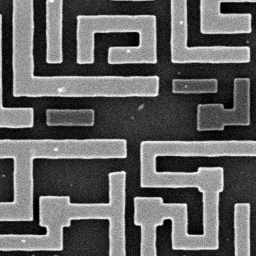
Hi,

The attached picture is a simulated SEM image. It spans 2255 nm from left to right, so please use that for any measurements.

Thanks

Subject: wiring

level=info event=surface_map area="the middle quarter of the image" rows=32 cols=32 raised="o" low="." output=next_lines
................................
................................
................................
oooooooooooooooooooooooo........
oooooooooooooooooooooooo...ooooo
oooooooooooooooooooooooo...ooooo
oooooooooooooooooooooooo...ooooo
ooooooooooooooooooooooo.........
................................
................................
................................
oo..ooo.........................
ooooooo.........................
ooooooo.........................
ooooooo.........................
................................
................................
................................
................................
ooooooooooooooo.................
ooooooooooooooo....ooooooooooooo
ooooooooooooooo....ooooooooooooo
ooooooooooooooo....ooooooooooooo
...................oooo.........
...................oooo.........
...................oooo.........
...................oooo.........
............ooo....ooooooooooooo
............ooo....ooooooooooooo
............ooo....ooooooooooooo
............ooo....ooooooooooooo
............ooo.................